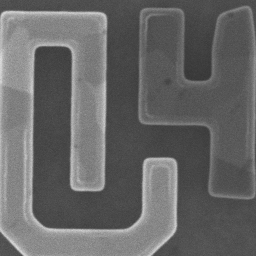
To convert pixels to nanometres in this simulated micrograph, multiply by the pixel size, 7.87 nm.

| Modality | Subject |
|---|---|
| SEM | wiring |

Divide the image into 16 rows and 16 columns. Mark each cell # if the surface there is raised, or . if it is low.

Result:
................
#######..###..##
#######..##..###
##..###..##..###
##...##..###.###
##...##..#######
##..###..#######
##..###..#######
##..###......###
##..###......###
##..###..##..###
##..##...##..###
##.......##.....
##.......##.....
###########.....
.#########......